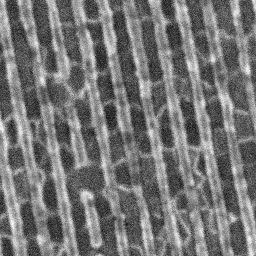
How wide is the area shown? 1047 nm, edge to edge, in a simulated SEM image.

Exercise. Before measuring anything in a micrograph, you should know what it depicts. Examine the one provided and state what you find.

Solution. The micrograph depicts parallel lines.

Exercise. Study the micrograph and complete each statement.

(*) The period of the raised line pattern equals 104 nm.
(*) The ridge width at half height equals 38.7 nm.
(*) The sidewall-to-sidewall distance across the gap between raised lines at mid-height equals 66.3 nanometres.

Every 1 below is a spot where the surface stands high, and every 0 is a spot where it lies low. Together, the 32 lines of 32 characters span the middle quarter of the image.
10000111000011000011100001100001
10000111000011000011100001100001
10000111000011000011100001100001
00000111000011000001100001100000
00000111000011100001100001100000
00000011000011100001100000100000
00000011000001100001100000110000
00000011100001100001100000110000
00000001100001110001110000110000
00000001100001110000110000111000
01000001100001110000110000111000
01100001110001110000110000011000
01100001110001110000110000011000
01100001110001110000011000011100
01110001110000111000011000011100
01110000110000111000011000011100
00110000110000111000011000011100
00110000111000011000001100001100
00111000111000011000001100001100
00111000011000011000001100001100
00111000011000011100001100001110
00111000011000011100001100001110
00011000011000001100001100000110
00011100011000001100000110000110
00011100001100001110000110000111
00000000001100001110000110000111
00000000001100000110000110000111
00000000001100000110000110000011
00000000001110000110000111000011
00000000000110000110000011000011
00000000000110000110000011000011
00000000000110000010000011000011